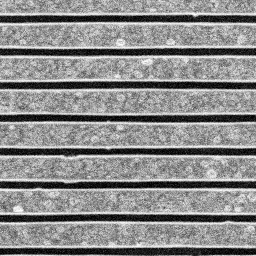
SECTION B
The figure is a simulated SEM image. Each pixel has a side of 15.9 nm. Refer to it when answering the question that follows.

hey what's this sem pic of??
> parallel lines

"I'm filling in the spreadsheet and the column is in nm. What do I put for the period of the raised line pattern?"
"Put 528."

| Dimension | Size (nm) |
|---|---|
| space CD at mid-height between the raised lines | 139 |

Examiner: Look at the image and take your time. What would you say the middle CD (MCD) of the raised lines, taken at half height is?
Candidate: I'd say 391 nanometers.